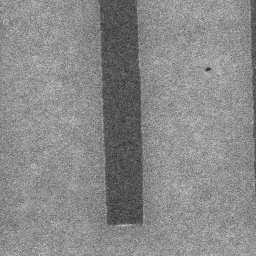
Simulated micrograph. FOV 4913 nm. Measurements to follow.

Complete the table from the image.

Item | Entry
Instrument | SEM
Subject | one or a few lines or trenches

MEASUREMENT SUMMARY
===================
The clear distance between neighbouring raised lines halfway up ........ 2130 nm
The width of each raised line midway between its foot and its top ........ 748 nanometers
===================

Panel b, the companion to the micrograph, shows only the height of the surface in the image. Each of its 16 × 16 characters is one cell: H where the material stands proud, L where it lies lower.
LLLLLLHHHLLLLLLL
LLLLLLHHHLLLLLLL
LLLLLLHHHLLLLLLL
LLLLLLHHHLLLLLLL
LLLLLLHHHLLLLLLL
LLLLLLHHHLLLLLLL
LLLLLLHHHLLLLLLL
LLLLLLHHHLLLLLLL
LLLLLLHHHLLLLLLL
LLLLLLHHHLLLLLLL
LLLLLLLHHLLLLLLL
LLLLLLLHHLLLLLLL
LLLLLLLHHLLLLLLL
LLLLLLLHHLLLLLLL
LLLLLLLLLLLLLLLL
LLLLLLLLLLLLLLLL